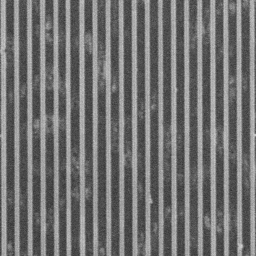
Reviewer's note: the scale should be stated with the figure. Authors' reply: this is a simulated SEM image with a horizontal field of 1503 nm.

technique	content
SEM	parallel lines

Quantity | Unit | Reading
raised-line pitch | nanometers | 76.9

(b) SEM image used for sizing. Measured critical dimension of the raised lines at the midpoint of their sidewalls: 0.0198 micrometres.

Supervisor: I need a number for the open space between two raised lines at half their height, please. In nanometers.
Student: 58.7